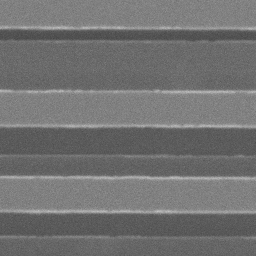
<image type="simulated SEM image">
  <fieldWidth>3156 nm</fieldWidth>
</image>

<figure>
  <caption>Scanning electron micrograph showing lines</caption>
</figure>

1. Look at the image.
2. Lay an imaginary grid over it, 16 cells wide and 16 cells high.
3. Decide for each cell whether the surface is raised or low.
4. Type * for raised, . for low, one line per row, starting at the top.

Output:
****************
****************
................
................
................
................
****************
****************
................
................
................
****************
****************
................
................
................